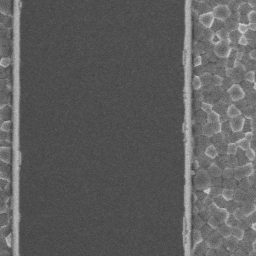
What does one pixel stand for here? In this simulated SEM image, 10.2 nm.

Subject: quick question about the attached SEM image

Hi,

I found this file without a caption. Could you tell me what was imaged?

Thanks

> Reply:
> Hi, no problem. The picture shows one or a few lines or trenches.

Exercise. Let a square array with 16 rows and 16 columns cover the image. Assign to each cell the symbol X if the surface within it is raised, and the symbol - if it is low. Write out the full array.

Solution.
-XXXXXXXXXXX----
-XXXXXXXXXXX----
-XXXXXXXXXXX----
-XXXXXXXXXXX----
-XXXXXXXXXXX----
-XXXXXXXXXXX----
-XXXXXXXXXXX----
-XXXXXXXXXXX----
-XXXXXXXXXXX----
-XXXXXXXXXXX----
-XXXXXXXXXXX----
-XXXXXXXXXXX----
-XXXXXXXXXXX----
-XXXXXXXXXXX----
-XXXXXXXXXXX----
-XXXXXXXXXXX----